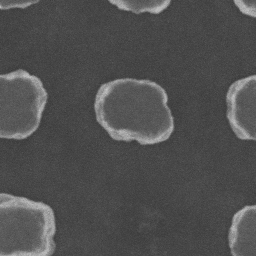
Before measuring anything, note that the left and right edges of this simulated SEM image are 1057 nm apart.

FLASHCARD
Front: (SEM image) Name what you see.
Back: raised bodies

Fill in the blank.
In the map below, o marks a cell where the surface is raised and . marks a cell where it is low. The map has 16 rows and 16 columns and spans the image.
o.......oo.....o
................
................
................
................
ooo....ooo.....o
ooo...oooo.....o
oo....ooooo....o
oo......oo......
................
................
................
................
ooo............o
ooo............o
ooo...........oo